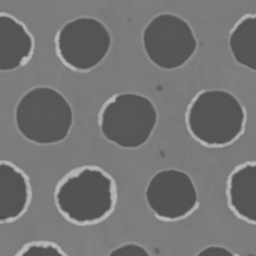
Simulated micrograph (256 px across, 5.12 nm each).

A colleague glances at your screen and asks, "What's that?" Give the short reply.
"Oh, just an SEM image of holes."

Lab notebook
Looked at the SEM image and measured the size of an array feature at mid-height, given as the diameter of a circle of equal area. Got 264 nanometers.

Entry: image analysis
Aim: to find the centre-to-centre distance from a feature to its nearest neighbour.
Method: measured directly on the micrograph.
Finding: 0.434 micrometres